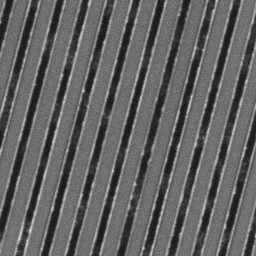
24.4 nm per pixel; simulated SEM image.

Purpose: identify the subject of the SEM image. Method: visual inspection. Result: parallel lines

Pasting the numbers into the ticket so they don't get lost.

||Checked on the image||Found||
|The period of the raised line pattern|0.597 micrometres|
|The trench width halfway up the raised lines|366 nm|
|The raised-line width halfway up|230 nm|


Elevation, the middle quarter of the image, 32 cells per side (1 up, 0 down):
11000011100001100001100001110000
11000011000011100001100001100001
11000011000011000011100001100001
11000011000011000011100011100001
10000111000011000011000011100001
10000110000111000011000011000011
10000110000110000111000011000011
10001110000110000111000111000011
00001110000110000110000111000011
00001100001110000110000110000111
00001100001100001110000110000110
00011100001100001100001110000110
00011100001100001100001110001110
00011000011100001100001100001110
00011000011000011100001100001100
00111000011000011000011100001100
00111000111000011000011000011100
00110000111000011000011000011100
00110000110000111000011000011000
01110000110000110000111000011000
01100001110000110000110000111000
01100001110001110000110000111000
01100001100001110000110000110000
11100001100001100001110000110000
11000011100001100001100001110000
11000011100011100001100001100001
11000011000011100001100001100001
11000011000011000011100001100001
10000111000011000011000011100001
10000110000111000011000011000011
10000110000111000111000011000011
10000110000110000111000011000011